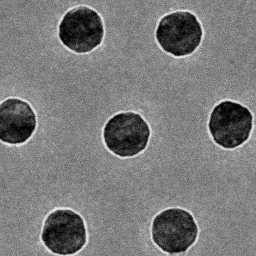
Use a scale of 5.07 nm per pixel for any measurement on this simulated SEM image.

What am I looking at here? holes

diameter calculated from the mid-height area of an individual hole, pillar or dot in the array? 46.3 px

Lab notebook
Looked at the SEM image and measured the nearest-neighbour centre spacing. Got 101 px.